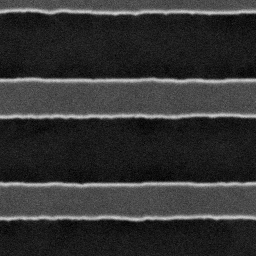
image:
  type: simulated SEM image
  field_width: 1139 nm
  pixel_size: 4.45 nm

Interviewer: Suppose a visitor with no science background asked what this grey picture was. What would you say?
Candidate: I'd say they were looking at lines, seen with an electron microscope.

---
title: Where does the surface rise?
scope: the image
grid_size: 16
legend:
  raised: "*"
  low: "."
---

****************
................
................
................
................
****************
****************
................
................
................
................
****************
****************
****************
................
................